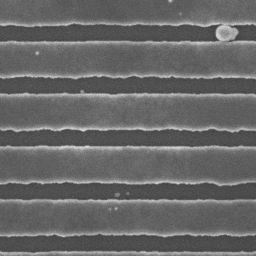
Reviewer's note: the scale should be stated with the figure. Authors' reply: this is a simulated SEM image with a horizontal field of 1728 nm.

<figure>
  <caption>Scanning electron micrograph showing lines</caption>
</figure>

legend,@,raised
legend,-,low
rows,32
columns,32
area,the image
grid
@@@@@@@@@@@@@@@@@@@@@@@@@@@@@@@@
@@@@@@@@@@@@@@@@@@@@@@@@@@@@@@@@
@@@@@@@@@@@@@@@@@@@@@@@@@@@@@@@@
---------------------------@@---
---------------------------@@---
@@@@@@@@@@@@@@@@@@@@@@@@@@@@@@@@
@@@@@@@@@@@@@@@@@@@@@@@@@@@@@@@@
@@@@@@@@@@@@@@@@@@@@@@@@@@@@@@@@
@@@@@@@@@@@@@@@@@@@@@@@@@@@@@@@@
@@@@@@@@@@@@@@@@@@@@@@@@@@@@@@@@
--------------------------------
--------------------------------
@@@@@@@@@@@@@@@@@@@@@@@@@@@@@@@@
@@@@@@@@@@@@@@@@@@@@@@@@@@@@@@@@
@@@@@@@@@@@@@@@@@@@@@@@@@@@@@@@@
@@@@@@@@@@@@@@@@@@@@@@@@@@@@@@@@
--------------------------------
--------------------------------
@@@@@@@@@@@@@@@@@@@@@@@@@@@@@@@@
@@@@@@@@@@@@@@@@@@@@@@@@@@@@@@@@
@@@@@@@@@@@@@@@@@@@@@@@@@@@@@@@@
@@@@@@@@@@@@@@@@@@@@@@@@@@@@@@@@
@@@@@@@@@@@@@@@@@@@@@@@@@@@@@@@@
--------------------------------
--------------------------------
@@@@@@@@@@@@@@@@@@@@@@@@@@@@@@@@
@@@@@@@@@@@@@@@@@@@@@@@@@@@@@@@@
@@@@@@@@@@@@@@@@@@@@@@@@@@@@@@@@
@@@@@@@@@@@@@@@@@@@@@@@@@@@@@@@@
@@------@-----------@--------@--
--------------------------------
------@----@@-------------------